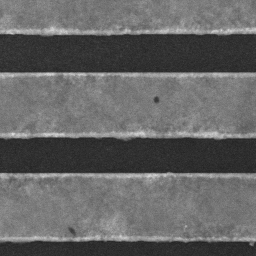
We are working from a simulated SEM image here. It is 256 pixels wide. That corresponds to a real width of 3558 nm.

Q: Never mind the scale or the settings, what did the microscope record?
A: lines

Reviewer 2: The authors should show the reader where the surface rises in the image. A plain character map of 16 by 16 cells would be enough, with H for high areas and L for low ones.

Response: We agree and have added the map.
HHHHHHHHHHHHHHHH
HHHHHHHHHHHHHHHH
LLLLLLLLLLLLLLLL
LLLLLLLLLLLLLLLL
LLLLLLLLLLLLLLLL
HHHHHHHHHHHHHHHH
HHHHHHHHHHHHHHHH
HHHHHHHHHHHHHHHH
HHHHHHHHHHHHHHHH
LLLLLLLLLLLLLLLL
LLLLLLLLLLLLLLLL
HHHHHHHHHHHHHHHH
HHHHHHHHHHHHHHHH
HHHHHHHHHHHHHHHH
HHHHHHHHHHHHHHHH
LLLLLLLLLLLLLLLL